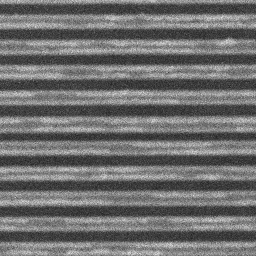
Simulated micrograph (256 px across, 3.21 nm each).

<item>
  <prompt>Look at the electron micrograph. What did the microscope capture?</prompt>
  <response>parallel lines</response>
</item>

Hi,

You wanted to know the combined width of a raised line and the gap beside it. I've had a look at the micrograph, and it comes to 80.9 nm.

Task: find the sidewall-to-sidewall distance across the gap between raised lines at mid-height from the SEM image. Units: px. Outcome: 14.9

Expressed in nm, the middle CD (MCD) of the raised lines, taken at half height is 34.9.